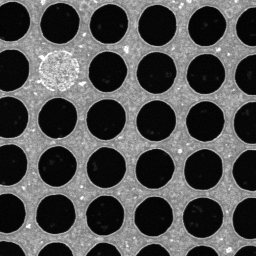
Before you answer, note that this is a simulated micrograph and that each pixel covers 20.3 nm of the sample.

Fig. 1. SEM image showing a regular array of holes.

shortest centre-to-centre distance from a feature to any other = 47.7 pixels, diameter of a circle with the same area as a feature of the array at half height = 809 nm